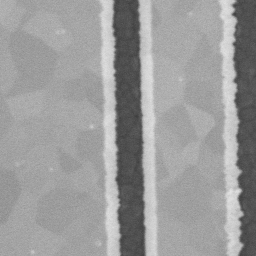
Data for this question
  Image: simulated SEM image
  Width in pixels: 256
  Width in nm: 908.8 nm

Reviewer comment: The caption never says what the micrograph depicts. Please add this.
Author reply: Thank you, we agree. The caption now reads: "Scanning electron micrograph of one or a few lines or trenches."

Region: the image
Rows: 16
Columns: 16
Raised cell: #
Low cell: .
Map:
#######..#####..
#######..#####..
#######..#####..
#######..#####..
#######..#####..
#######..#####..
#######..######.
#######..#####..
#######..#####..
#######..#####..
#######..######.
#######..######.
#######..######.
#######..######.
#######..######.
#######..######.